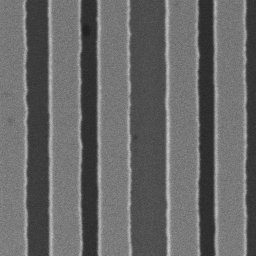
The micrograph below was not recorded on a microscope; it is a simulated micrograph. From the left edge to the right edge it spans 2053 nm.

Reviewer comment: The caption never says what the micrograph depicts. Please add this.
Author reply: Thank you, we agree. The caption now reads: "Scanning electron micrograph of lines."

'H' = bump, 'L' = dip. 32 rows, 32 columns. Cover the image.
HHHLLLHHHHLLHHHHLLLLLHHHHLLHHHHL
HHHLLLHHHHLLHHHHLLLLLHHHHLLHHHHL
HHHLLLHHHHLLHHHHLLLLLHHHHLLHHHHL
HHHLLLHHHHLLHHHHLLLLLHHHHLLHHHHL
HHHLLLHHHHLLHHHHLLLLLHHHHLLHHHHL
HHHLLLHHHHLLHHHHLLLLLHHHHLLHHHHL
HHHLLLHHHHLLHHHHLLLLLHHHHLLHHHHL
HHHLLLHHHHLLHHHHLLLLLHHHHLLHHHHL
HHHLLLHHHHLLHHHHLLLLLHHHHLLHHHHL
HHHLLLHHHHLLHHHHLLLLLHHHHLLHHHHL
HHHLLLHHHHLLHHHHLLLLLHHHHLLHHHHL
HHHLLLHHHHLLHHHHLLLLLHHHHLLHHHHL
HHHLLLHHHHLLHHHHLLLLLHHHHLLHHHHL
HHHLLLHHHHLLHHHHLLLLLHHHHLLHHHHL
HHHLLLHHHHLLHHHHLLLLLHHHHLLHHHHL
HHHLLLHHHHLLHHHHLLLLLHHHHLLHHHHL
HHHLLLHHHHLLHHHHLLLLLHHHHLLHHHHL
HHHLLLHHHHLLHHHHLLLLLHHHHLLHHHHL
HHHLLLHHHHLLHHHHLLLLLHHHHLLHHHHL
HHHLLLHHHHLLHHHHLLLLLHHHHLLHHHHL
HHHLLLHHHHLLHHHHLLLLLHHHHLLHHHHL
HHHLLLHHHHLLHHHHLLLLLHHHHLLHHHHL
HHHLLLHHHHLLHHHHLLLLLHHHHLLHHHHL
HHHLLLHHHHLLHHHHLLLLLHHHHLLHHHHL
HHHLLLHHHHLLHHHHLLLLLHHHHLLHHHHL
HHHLLLHHHHLLHHHHLLLLLHHHHLLHHHHL
HHHLLLHHHHLLHHHHLLLLLHHHHLLHHHHL
HHHLLLHHHHLLHHHHLLLLLHHHHLLHHHHL
HHHLLLHHHHLLHHHHLLLLLHHHHLLHHHHL
HHHLLLHHHHLLHHHHLLLLLHHHHLLHHHHL
HHHLLLHHHHLLHHHHLLLLLHHHHLLHHHHL
HHHLLLHHHHLLHHHHLLLLLHHHHLLHHHHL